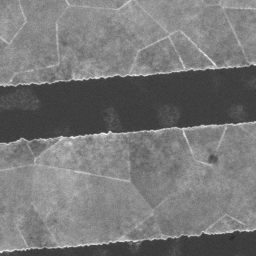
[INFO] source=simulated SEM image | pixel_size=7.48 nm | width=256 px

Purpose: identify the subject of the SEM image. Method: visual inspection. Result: one or a few lines or trenches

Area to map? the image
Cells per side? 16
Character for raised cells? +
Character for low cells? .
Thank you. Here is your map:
++++++++++++++++
++++++++++++++++
++++++++++++++++
++++++++++++++++
+++++++++++.....
................
................
................
.....+++++++++++
++++++++++++++++
++++++++++++++++
++++++++++++++++
++++++++++++++++
++++++++++++++++
++++++++++++++..
+++.............